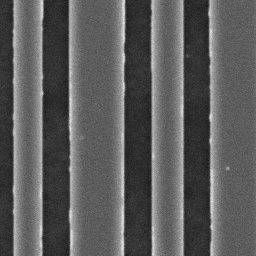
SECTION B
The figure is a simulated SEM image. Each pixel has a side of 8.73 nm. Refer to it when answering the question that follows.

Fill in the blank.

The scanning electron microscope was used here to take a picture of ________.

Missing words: lines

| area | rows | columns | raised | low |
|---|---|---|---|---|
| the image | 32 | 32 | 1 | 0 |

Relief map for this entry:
00111000011111110001111000111111
00111000011111110001111000111111
00111000011111110001111000111111
00111000011111110001111000111111
00111000011111110001111000111111
00111000011111110001111000111111
00111000011111110001111000111111
00111000011111110001111000111111
00111000011111100001111000111111
00111000011111100001111000111111
00111000011111110001111000111111
00111000011111110001111000111111
00111000011111100001111000111111
00111000011111100001111000111111
00111000011111100001111000111111
00111000011111100001111000111111
00111000011111100001111000111111
00111000011111100001111000111111
00111000011111100001111000111111
00111000011111100001111000111111
00111000011111100001111000111111
00111000011111100001111000111111
00111000011111100001111000111111
00111000011111100001111000111111
00111000011111100001111000111111
00111000011111100001111000111111
00111000011111100001111000111111
00111000011111100001111000111111
00111000011111100001111000111111
00111000011111100001111000111111
00111000011111100001111000111111
00111000011111100001111000111111